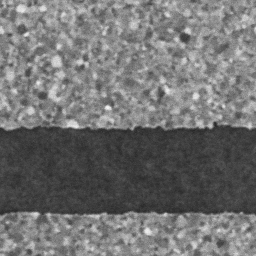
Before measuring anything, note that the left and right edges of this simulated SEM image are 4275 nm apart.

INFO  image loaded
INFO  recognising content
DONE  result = one or a few lines or trenches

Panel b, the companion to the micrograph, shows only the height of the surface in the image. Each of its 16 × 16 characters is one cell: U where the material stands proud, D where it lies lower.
UUUUUUUUUUUUUUUU
UUUUUUUUUUUUUUUU
UUUUUUUUUUUUUUUU
UUUUUUUUUUUUUUUU
UUUUUUUUUUUUUUUU
UUUUUUUUUUUUUUUU
UUUUUUUUUUUUUUUU
UUUUUUUUUUUUUUUU
DDDDDDDDDDDDDDDD
DDDDDDDDDDDDDDDD
DDDDDDDDDDDDDDDD
DDDDDDDDDDDDDDDD
DDDDDDDDDDDDDDDD
UUUUUDUUUUUUUUUU
UUUUUUUUUUUUUUUU
UUUUUUUUUUUUUUUU